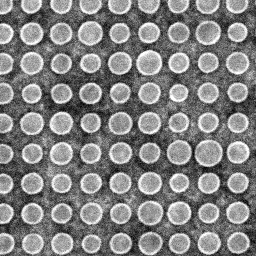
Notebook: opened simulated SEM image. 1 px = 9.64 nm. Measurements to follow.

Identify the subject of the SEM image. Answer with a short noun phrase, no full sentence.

a regular array of raised bodies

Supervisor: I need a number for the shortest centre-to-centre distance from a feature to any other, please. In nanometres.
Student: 282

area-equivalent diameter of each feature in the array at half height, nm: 192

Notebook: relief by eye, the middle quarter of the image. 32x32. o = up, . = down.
oo..ooooo..oooooo..ooooo...oooo.
o....ooo....oooo...ooooo...ooo..
....................oo..........
................................
................................
o....ooo.....ooo....ooo.....oo..
oo..ooooo...oooo...ooooo...oooo.
oo..ooooo...oooo...ooooo...oooo.
o...ooooo...oooo...oooo....ooo..
.....ooo.....oo.....ooo.........
................................
................................
o.....o......oo.....ooo.........
oo...oooo...oooo...ooooo...oooo.
oo...oooo..oooooo..ooooo..ooooo.
oo...oooo..oooooo..ooooo..ooooo.
o....ooo....oooo...oooo....ooo..
................................
................................
............................oo..
o....ooo....oooo....ooo...ooooo.
oo..ooooo...ooooo..ooooo..oooooo
oo..ooooo...ooooo..ooooo..oooooo
oo..ooooo...oooo...oooo...ooooo.
o.....o......oo............ooo..
................................
................................
.......o.....oo.....ooo.........
o....oooo...oooo...ooooo...oooo.
oo..ooooo...oooo...ooooo...oooo.
o...ooooo...oooo...ooooo...oooo.
o....ooo....oooo...oooo....ooo..